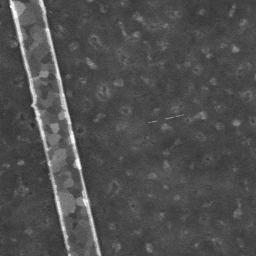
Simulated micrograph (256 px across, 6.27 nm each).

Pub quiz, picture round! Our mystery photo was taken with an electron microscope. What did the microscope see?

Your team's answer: one or a few lines or trenches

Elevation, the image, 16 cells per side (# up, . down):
.##.............
.##.............
.##.............
.##.............
..##............
..##............
..##............
..##............
...##...........
...##...........
...##...........
...##...........
....#...........
....##..........
....##..........
....##..........